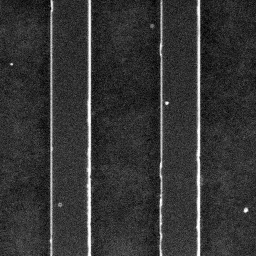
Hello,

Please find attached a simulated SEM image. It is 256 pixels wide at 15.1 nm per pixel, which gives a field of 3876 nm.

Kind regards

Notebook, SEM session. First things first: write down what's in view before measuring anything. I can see lines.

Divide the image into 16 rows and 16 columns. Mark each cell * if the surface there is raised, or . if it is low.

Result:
...***....**....
...***....**....
...***....**....
...***....**....
...***....**....
...***....**....
...***....**....
...***....**....
...***....**....
...***....**....
...***....**....
...***....**....
...***....**....
...***....**....
...***....**....
...***....**....